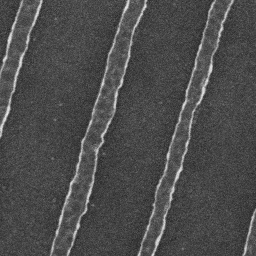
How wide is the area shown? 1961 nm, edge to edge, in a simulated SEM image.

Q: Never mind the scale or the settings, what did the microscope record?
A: one or a few lines or trenches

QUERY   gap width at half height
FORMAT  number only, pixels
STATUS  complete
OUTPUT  67